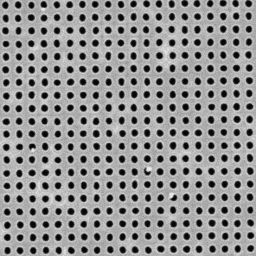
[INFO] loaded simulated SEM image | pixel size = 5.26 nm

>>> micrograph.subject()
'a regular array of holes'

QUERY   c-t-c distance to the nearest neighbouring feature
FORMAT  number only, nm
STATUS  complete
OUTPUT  65.2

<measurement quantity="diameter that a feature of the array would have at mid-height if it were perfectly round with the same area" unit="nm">36.1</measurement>